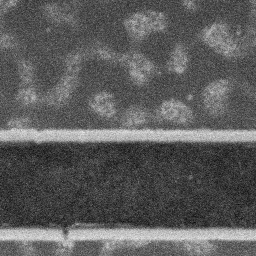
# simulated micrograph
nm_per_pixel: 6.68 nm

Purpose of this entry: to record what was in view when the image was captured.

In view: one or a few lines or trenches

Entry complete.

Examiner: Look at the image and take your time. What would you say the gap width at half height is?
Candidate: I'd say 0.658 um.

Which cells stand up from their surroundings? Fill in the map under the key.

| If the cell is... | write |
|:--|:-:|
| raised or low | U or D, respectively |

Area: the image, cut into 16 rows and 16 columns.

UUUUUUUUUUUUUUUU
UUUUUUUUUUUUUUUU
UUUUUUUUUUUUUUUU
UUUUUUUUUUUUUUUU
UUUUUUUUUUUUUUUU
UUUUUUUUUUUUUUUU
UUUUUUUUUUUUUUUU
UUUUUUUUUUUUUUUU
DDUDDUDDDDDDDDDD
DDDDDDDDDDDDDDDD
DDDDDDDDDDDDDDDD
DDDDDDDDDDDDDDDD
DDDDDDDDDDDDDDDD
DDDDDDDDDDDDDDDD
DDDDDDDDDDDDDDDD
UUUUUUUUUUUUUUUU